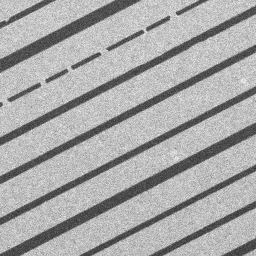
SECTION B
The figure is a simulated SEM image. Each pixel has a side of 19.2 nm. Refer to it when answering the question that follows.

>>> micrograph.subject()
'parallel lines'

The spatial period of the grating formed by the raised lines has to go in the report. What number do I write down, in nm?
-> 662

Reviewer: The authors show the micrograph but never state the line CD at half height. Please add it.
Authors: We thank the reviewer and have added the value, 26.3 px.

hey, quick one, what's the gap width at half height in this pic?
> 149 nm